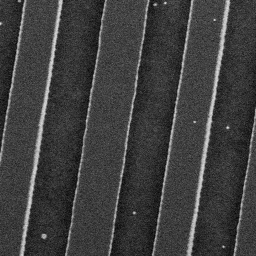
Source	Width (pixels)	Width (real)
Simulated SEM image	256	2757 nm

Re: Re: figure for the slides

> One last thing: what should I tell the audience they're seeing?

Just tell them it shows lines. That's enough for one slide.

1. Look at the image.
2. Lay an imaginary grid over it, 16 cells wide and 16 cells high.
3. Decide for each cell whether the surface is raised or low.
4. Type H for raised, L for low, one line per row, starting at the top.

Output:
LHHHLLHHHLLLHHLL
LHHHLLHHHLLLHHLL
LHHLLLHHHLLLHHLL
LHHLLLHHHLLHHHLL
LHHLLLHHHLLHHHLL
LHHLLLHHHLLHHLLL
HHHLLLHHLLLHHLLL
HHHLLHHHLLLHHLLL
HHHLLHHHLLLHHLLL
HHLLLHHHLLLHHLLL
HHLLLHHHLLHHHLLH
HHLLLHHHLLHHHLLH
HHLLLHHLLLHHLLLH
HHLLLHHLLLHHLLLH
HHLLHHHLLLHHLLLH
HLLLHHHLLLHHLLLH